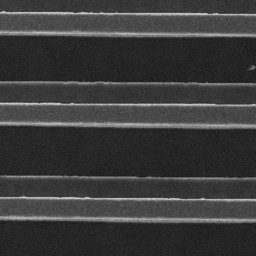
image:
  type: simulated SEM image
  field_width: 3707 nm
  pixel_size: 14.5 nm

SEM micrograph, lines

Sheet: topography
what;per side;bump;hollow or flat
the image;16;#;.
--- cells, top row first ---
################
################
................
................
................
################
################
################
................
................
................
################
################
################
................
................